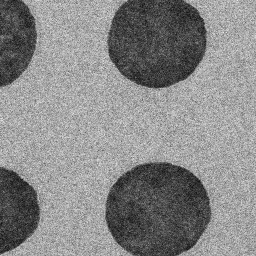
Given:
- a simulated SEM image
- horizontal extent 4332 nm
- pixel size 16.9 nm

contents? holes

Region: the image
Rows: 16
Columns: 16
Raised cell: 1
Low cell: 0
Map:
0011111000001111
0011111000000111
0011111000000111
0011111000000111
0111111100001111
1111111111111111
1111111111111111
1111111111111111
1111111111111111
1111111111111111
1111111100011111
0011111000000111
0011111000000111
0011111000000111
0011111000000111
0111111100001111